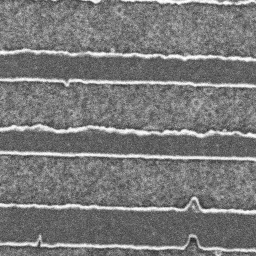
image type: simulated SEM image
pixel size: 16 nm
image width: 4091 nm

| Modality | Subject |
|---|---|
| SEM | one or a few lines or trenches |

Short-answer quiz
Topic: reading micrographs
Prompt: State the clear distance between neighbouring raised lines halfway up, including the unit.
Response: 811 nm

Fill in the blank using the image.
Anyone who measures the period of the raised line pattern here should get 1260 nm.